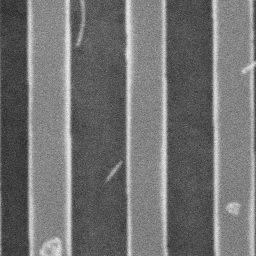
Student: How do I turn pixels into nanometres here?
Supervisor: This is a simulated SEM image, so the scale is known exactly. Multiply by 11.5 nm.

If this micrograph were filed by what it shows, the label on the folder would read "lines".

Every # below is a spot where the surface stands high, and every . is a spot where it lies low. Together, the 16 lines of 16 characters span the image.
..##....##...###
..##....##...###
..##....##...###
..##....##...###
..##....##...###
..##....##...###
..##....##...###
..##....##...###
..##....##...###
..##....##...###
..##....##...###
..##....##...###
..##....##...###
..##....##...###
..##....##...###
..##....##...###